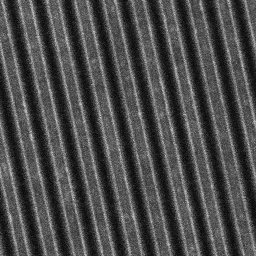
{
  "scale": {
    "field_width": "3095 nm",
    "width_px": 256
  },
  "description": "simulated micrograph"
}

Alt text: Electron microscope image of parallel lines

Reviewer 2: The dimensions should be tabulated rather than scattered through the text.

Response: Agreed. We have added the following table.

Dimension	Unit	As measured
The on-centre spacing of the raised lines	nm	334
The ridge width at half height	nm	214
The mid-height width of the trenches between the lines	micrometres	0.122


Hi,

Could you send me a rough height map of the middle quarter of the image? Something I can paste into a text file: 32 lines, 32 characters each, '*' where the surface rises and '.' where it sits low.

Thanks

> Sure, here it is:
..****...*****..*****..*****..**
..*****..*****...****...****...*
..*****...****...****...****...*
...****...****...****...*****..*
...****...****...*****..*****..*
*..*****..*****..*****..*****..*
*..*****..*****...****...****...
*...****...****...****...****...
*...****...****...****...*****..
**..****...*****..*****..*****..
**..*****..*****..*****...****..
**..*****...****...****...****..
**...****...****...****...*****.
**...****...****...*****..*****.
***..*****..*****..*****...****.
***..*****..*****...****...****.
***...****...****...****...****.
***...****...****...****...*****
***...****...*****..*****..*****
****..*****..*****..*****...****
****..*****...****...****...****
****...****...****...****...****
****...****...****...*****..****
****...****...*****..*****..****
*****..*****..*****...****...***
.****..*****...****...****...***
.****...****...****...****...***
.****...****...****...*****..***
.*****..*****..*****..*****...**
.*****..*****..*****...****...**
..****...****...****...****...**
..****...****...****...****...**